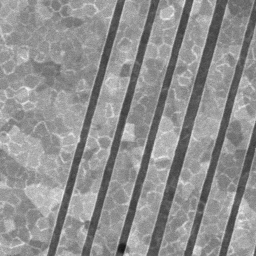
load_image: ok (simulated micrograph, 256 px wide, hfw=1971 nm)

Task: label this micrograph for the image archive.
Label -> parallel lines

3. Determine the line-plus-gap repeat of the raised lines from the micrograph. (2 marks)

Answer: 252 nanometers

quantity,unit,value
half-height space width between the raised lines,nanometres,67.7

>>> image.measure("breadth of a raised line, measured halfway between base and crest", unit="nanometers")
185